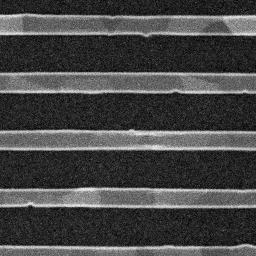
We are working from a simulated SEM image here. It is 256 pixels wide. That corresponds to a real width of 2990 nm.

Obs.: parallel lines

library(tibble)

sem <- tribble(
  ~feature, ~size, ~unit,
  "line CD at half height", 209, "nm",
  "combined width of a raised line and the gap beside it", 672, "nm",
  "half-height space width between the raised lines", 466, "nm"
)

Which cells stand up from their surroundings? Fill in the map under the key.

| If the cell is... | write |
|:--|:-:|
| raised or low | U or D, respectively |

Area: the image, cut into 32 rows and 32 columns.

DDDDDDDDDDDDDDDDDDDDDDDDDDDDDDDD
DDDDDDDDDDDDDDDDDDDDDDDDDDDDDDDD
UUUUUUUUUUUUUUUUUUUUUUUUUUUUUUUU
UUUUUUUUUUUUUUUUUUUUUUUUUUUUUUUU
DDDDDDDDDDDDDDDDDDDDDDDDDDDDDDDD
DDDDDDDDDDDDDDDDDDDDDDDDDDDDDDDD
DDDDDDDDDDDDDDDDDDDDDDDDDDDDDDDD
DDDDDDDDDDDDDDDDDDDDDDDDDDDDDDDD
DDDDDDDDDDDDDDDDDDDDDDDDDDDDDDDD
UUUUUUUUUUUUUUUUUUUUUUUUUUUUUUUU
UUUUUUUUUUUUUUUUUUUUUUUUUUUUUUUU
DDDDDDDDDDUUUDDDDDUUUDUUUUUUUUUU
DDDDDDDDDDDDDDDDDDDDDDDDDDDDDDDD
DDDDDDDDDDDDDDDDDDDDDDDDDDDDDDDD
DDDDDDDDDDDDDDDDDDDDDDDDDDDDDDDD
DDDDDDDDDDDDDDDDDDDDDDDDDDDDDDDD
DDDUUUUUUUUUUUDUUUUDDDDDDDDDDDDD
UUUUUUUUUUUUUUUUUUUUUUUUUUUUUUUU
UUUUUUUUUUUUUUUUUUUUUUUUUDDDUUUU
DDDDDDDDDDDDDDDDDDDDDDDDDDDDDDDD
DDDDDDDDDDDDDDDDDDDDDDDDDDDDDDDD
DDDDDDDDDDDDDDDDDDDDDDDDDDDDDDDD
DDDDDDDDDDDDDDDDDDDDDDDDDDDDDDDD
DDDDDDDDDDDDDDDDDDDDDDDDDDDDDDDD
UUUUUUUUUUUUUUUUUUUUUUUUUUUUUUUU
UUUUUUUUUUUUUUUUUUUUUUUUUUUUUUUU
DDDDDDDDDDDDDDDDDDDDDDDDDDDDDDDD
DDDDDDDDDDDDDDDDDDDDDDDDDDDDDDDD
DDDDDDDDDDDDDDDDDDDDDDDDDDDDDDDD
DDDDDDDDDDDDDDDDDDDDDDDDDDDDDDDD
DDDDDDDDDDDDDDDDDDDDDDDDDDDDDDDD
UUUUUUUUUUUUUUUUUUUUUUUUUUUUUUUU